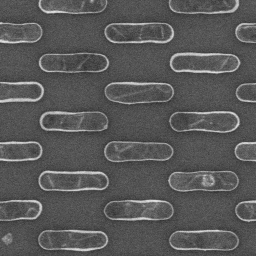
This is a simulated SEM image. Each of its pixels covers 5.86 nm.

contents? groups of lines, slits or small figures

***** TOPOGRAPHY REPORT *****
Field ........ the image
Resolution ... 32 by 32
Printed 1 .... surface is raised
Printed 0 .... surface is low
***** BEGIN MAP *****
00000111111110000000011111111100
00000011111100000000001111111000
00000000000000000000000000000000
11111000000001111111100000000011
11111000000001111111110000000011
00000000000000000000000000000000
00000000000000000000000000000000
00000111111110000000011111111100
00000111111110000000001111111100
00000000000000000000000000000000
11111000000000111111100000000011
11111000000001111111110000000011
11000000000000111111100000000011
00000000000000000000000000000000
00000111111110000000011111111100
00000111111110000000011111111100
00000000000000000000000000000000
00000000000000000000000000000000
11111000000001111111100000000011
11111000000001111111100000000011
00000000000000000000000000000000
00000000000000000000000001011000
00000111111110000000011111111100
00000111111110000000001111111000
00000000000000000000000000000000
11111000000000111111100000000011
11111000000001111111110000000011
00000000000000000000000000000001
00000000000000000000000000000000
00000111111110000000011111111100
00000111111110000000011111111100
00000000000000000000000000000000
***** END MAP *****